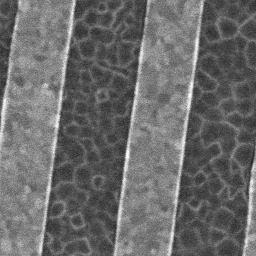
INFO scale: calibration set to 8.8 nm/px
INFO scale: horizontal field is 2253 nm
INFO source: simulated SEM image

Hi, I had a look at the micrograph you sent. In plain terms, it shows one or a few lines or trenches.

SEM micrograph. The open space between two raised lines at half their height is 636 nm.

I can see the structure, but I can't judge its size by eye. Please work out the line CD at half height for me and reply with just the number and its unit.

55.6 px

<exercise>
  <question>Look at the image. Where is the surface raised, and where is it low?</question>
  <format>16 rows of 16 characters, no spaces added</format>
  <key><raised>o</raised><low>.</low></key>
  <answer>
.oooo....oooo...
.ooo.....ooo....
.ooo.....ooo....
.ooo.....ooo....
.ooo.....ooo....
oooo....oooo....
oooo....oooo....
oooo....oooo....
oooo....oooo....
ooo.....ooo.....
ooo.....ooo.....
ooo.....ooo.....
ooo.....ooo.....
ooo....oooo.....
ooo....oooo....o
ooo....oooo....o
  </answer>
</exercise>